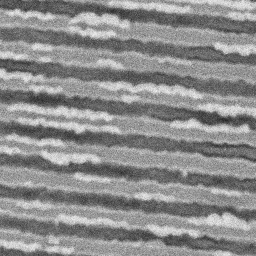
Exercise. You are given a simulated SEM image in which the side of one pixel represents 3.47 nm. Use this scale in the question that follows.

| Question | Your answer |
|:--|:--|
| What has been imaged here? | parallel lines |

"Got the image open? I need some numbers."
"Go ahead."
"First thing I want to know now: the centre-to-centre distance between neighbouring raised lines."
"109 nanometres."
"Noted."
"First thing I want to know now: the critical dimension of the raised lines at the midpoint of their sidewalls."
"17.2 pixels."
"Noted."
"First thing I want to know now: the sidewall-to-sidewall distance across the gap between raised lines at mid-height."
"50.6 nanometers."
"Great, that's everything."